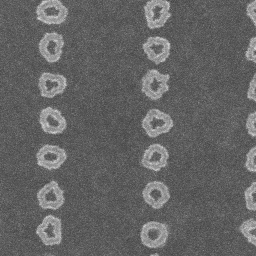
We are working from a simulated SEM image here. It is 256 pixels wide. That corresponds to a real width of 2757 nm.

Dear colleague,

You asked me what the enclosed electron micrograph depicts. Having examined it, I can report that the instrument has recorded a regular array of ring-shaped raised bodies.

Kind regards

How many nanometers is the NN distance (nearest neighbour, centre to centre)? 384